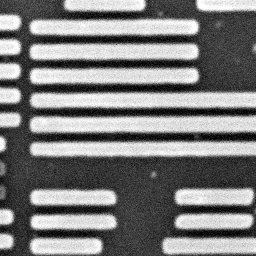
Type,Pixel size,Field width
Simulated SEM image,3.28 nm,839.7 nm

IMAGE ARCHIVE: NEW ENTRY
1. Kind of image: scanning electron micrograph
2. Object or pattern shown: wiring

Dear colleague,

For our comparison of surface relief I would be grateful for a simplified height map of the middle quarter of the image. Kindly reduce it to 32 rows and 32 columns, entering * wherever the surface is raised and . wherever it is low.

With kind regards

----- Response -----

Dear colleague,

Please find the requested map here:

................................
......**************************
********************************
********************************
**************************.*****
................................
................................
................................
********************************
********************************
.........*************.........*
................................
................................
.............*******************
********************************
********************************
********************************
................................
................................
................................
********************************
********************************
********************************
................................
................................
................................
................................
................................
................................
................................
................................
................................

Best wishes